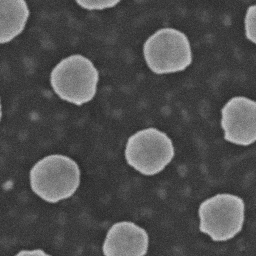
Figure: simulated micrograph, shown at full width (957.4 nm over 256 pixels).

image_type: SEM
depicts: raised bodies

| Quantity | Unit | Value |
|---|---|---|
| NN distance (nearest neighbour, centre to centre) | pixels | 97.8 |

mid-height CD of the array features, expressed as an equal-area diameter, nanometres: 170